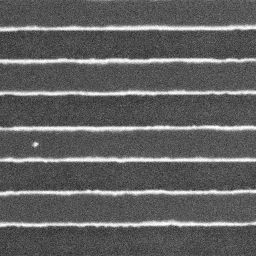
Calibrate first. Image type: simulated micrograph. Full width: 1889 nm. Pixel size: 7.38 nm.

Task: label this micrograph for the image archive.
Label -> lines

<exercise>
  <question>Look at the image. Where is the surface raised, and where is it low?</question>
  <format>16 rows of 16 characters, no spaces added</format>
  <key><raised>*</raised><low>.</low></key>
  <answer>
****************
****************
................
................
****************
****************
................
................
****************
****************
................
................
****************
****************
................
................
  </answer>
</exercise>